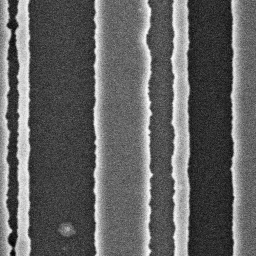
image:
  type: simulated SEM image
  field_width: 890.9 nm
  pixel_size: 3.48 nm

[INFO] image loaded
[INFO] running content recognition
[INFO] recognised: lines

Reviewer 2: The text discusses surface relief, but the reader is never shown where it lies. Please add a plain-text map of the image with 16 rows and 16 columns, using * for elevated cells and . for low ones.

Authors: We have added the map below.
**....******..**
**....******...*
**....******...*
**....******...*
**....******...*
**....******...*
**....******..**
**....******...*
**....******...*
**....******...*
**....******...*
**....******...*
**....******...*
**....******...*
**....******...*
**....******...*